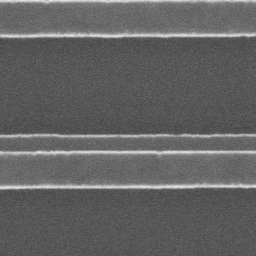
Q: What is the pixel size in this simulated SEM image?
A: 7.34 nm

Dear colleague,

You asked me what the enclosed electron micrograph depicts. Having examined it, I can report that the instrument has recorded lines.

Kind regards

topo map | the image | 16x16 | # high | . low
################
################
................
................
................
................
................
................
.###.###########
################
################
################
................
................
................
................